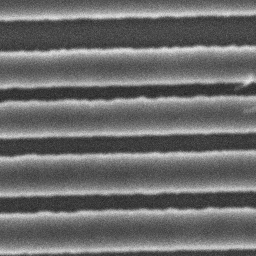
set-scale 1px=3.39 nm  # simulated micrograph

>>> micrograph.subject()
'lines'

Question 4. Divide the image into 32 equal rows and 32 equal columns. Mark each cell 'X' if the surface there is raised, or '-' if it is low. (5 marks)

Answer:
XXXXXXXXXXXXXXXXXXXXXXXXXXXXXXXX
XXXXXXXXXXXXXXXXXXXXXXXXXXXXXXXX
--------------------------------
--------------------------------
--------------------------------
--------------------------------
----X-XXXXXXXXXXXXXXXXXXXXXXXXXX
XXXXXXXXXXXXXXXXXXXXXXXXXXXXXXXX
XXXXXXXXXXXXXXXXXXXXXXXXXXXXXXXX
XXXXXXXXXXXXXXXXXXXXXXXXXXXXXXXX
XXXXXXXXXXXXXXXXXX--------------
--------------------------------
---------------XXXXXXXXXXXXXXXXX
XXXXXXXXXXXXXXXXXXXXXXXXXXXXXXXX
XXXXXXXXXXXXXXXXXXXXXXXXXXXXXXXX
XXXXXXXXXXXXXXXXXXXXXXXXXXXXXXXX
XXXXXXXXXXXXXXXXXXXXXXXXXXXXXX--
--------------------------------
--------------------------------
---XXXXXXXXXXXXXXXXXXXXXXXXXXXXX
XXXXXXXXXXXXXXXXXXXXXXXXXXXXXXXX
XXXXXXXXXXXXXXXXXXXXXXXXXXXXXXXX
XXXXXXXXXXXXXXXXXXXXXXXXXXXXXXXX
XXXXXXXXXXXXXXXXXXXXXXXXXXXXXXXX
XX------------------------------
--------------------------------
----------XXXXXXXXXXXXXXXXXXXXXX
XXXXXXXXXXXXXXXXXXXXXXXXXXXXXXXX
XXXXXXXXXXXXXXXXXXXXXXXXXXXXXXXX
XXXXXXXXXXXXXXXXXXXXXXXXXXXXXXXX
XXXXXXXXXXXXXXXXXXXXXXXXXXXXXXXX
XXXXXXX-------------------------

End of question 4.